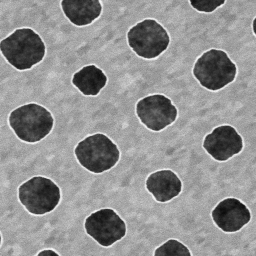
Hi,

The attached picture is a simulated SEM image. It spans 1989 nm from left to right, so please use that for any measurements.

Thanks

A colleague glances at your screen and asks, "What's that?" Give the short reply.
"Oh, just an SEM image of a regular array of holes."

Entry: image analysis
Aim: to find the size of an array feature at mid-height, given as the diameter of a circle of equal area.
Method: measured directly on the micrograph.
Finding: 0.292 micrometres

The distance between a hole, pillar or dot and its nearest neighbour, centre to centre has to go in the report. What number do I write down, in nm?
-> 556